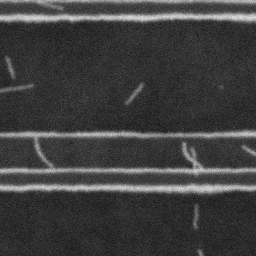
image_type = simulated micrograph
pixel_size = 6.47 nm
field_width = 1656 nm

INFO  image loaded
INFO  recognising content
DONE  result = lines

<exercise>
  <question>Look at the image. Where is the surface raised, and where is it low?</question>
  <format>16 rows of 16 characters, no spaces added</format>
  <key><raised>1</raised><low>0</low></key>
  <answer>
1111111111111111
0000000000000000
0000000000000000
0000000000000000
0000000000000000
0000000000000000
0000000000000000
0000000000000000
1111111111111111
1111111111111111
1111111111111111
1111111111111111
0000000000000000
0000000000000000
0000000000000000
0000000000000000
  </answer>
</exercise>